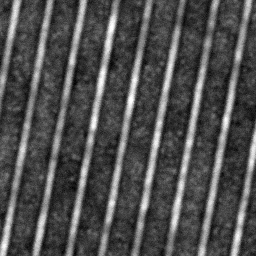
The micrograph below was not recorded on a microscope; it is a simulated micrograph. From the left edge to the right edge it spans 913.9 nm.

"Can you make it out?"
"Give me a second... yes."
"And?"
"parallel lines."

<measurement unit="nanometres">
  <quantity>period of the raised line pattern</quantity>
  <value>116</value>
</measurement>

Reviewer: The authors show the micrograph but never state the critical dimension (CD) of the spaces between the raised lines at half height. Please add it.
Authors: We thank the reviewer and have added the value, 0.0962 microns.